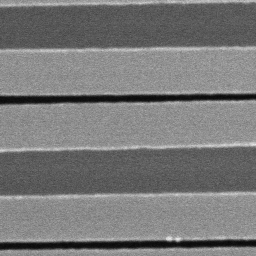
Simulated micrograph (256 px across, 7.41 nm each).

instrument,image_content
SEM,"lines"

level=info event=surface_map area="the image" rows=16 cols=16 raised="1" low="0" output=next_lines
0000000000000000
0000000000000000
0000000000000000
1111111111111111
1111111111111111
1111111111111111
0011111111111111
1111111111111111
1111111111111111
0000000000000000
0000000000000000
0000000000000000
1111111111111111
1111111111111111
1111111111111111
1111111111111111